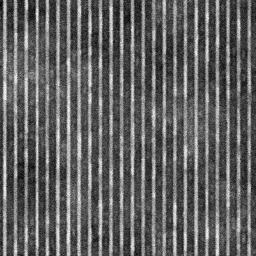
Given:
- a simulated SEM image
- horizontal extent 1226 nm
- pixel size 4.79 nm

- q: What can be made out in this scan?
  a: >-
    parallel lines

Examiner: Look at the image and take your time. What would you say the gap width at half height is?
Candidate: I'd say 37.7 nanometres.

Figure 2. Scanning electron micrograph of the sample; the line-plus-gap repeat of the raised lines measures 50.8 nm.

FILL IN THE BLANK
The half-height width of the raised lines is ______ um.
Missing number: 0.0126